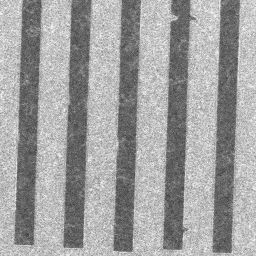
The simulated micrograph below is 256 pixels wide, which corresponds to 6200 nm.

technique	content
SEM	parallel lines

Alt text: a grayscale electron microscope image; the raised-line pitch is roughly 49.5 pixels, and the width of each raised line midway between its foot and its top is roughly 20.2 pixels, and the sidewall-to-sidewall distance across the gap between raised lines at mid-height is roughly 711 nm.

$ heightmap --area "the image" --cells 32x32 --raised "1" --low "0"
00011000011000011100011100001100
00011000011000011100011100001100
00011000011000011100001100011100
00011000011000011000011100011100
00011000011000011000011100011100
00011000011000011000011100011100
00011000011000011000011100011100
00011000011000011000011100011100
00011000011000011000011100011100
00011000011000011000011100011100
00111000011000011000011000011100
00111000011000011000011000011100
00111000011000011000011000011100
00111000011000011000011000011100
00111000111000011000011000011100
00111000111000011000011000011100
00111000111000011000011000011000
00111000111000011000011000011000
00111000111000011000011000011000
00111000111000011000011000011000
00111000111000011000011000011000
00110000111000011000011000011000
00110000111000111000011000011000
00110000111000111000011000011000
00110000111000111000011000011000
00110000111000111000011000011000
00110000111000111000111000011000
00110000110000111000111000011000
00110000110000111000111000011000
00110000110000111000111000011000
00110000110000111000111000111000
00000000000000000000000000011000